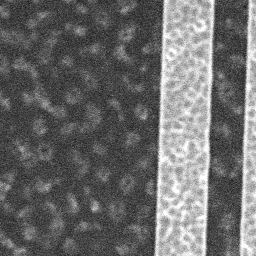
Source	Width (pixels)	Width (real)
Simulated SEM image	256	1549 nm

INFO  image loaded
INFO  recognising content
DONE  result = one or a few lines or trenches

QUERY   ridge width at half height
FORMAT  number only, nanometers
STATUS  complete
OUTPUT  294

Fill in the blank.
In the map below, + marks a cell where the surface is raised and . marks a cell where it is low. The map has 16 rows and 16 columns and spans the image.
..........+++...
..........+++...
..........+++...
..........+++...
..........+++..+
..........+++..+
..........+++..+
..........+++..+
..........+++..+
..........+++..+
..........+++..+
..........+++..+
..........+++..+
..........+++..+
..........+++..+
..........+++..+